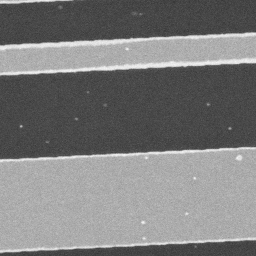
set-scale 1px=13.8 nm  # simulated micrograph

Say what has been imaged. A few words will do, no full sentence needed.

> lines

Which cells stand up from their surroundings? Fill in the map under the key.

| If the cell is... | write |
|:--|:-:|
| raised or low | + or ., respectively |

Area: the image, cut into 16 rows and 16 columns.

................
................
.......+++++++++
++++++++++++++++
++++............
................
................
................
................
..........++++++
++++++++++++++++
++++++++++++++++
++++++++++++++++
++++++++++++++++
++++++++++++++++
+++++...........